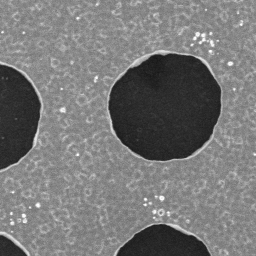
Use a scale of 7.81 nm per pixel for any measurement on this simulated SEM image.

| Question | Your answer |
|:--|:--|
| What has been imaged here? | holes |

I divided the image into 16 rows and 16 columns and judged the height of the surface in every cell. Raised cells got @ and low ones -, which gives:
@@@@@@@@@@@@@@@@
@@@@@@@@@@@@@@@@
@@@@@@@@@@@@@@@@
@@@@@@@@@---@@@@
-@@@@@@@-----@@@
--@@@@@-------@@
---@@@@-------@@
--@@@@@-------@@
--@@@@@------@@@
--@@@@@@----@@@@
@@@@@@@@@@@@@@@@
@@@@@@@@@@@@@@@@
@@@@@@@@@@@@@@@@
@@@@@@@@@@@@@@@@
@@@@@@@@@---@@@@
-@@@@@@@-----@@@